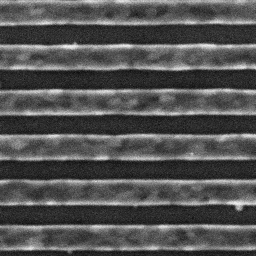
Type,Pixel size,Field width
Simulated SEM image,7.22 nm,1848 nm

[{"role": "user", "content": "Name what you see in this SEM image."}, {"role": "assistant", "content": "wiring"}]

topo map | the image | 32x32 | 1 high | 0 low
11111111111111111111111111111111
11111111111111111111111111111111
11111111111111111111111111111111
00000000000000000000000000000000
00000000000000000000000000000000
00000000000000000000000000000000
11111111111111111111111111111111
11111111111111111111111111111111
11111111111111111111111111111111
00000000000000000000000000000000
00000000000000000000000000000000
11111111111111111111111111111111
11111111111111111111111111111111
11111111111111111111111111111111
00000000000000000000000000000000
00000000000000000000000000000000
00000000000000000000000000000000
11111111111111111111111111111111
11111111111111111111111111111111
11111111111111111111111111111111
00000000000000000000000000000000
00000000000000000000000000000000
01100001100000011000000000000000
11111111111111111111111111111111
11111111111111111111111111111111
11111111111111111111111111000111
00000000000000000000000000000000
00000000000000000000000000000000
11111111111111111111111111111111
11111111111111111111111111111111
11111111111111111111111111111111
00000000000000000000000000000000